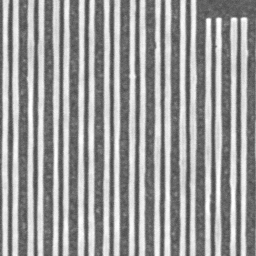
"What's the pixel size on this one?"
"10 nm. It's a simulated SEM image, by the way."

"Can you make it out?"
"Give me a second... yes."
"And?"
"parallel lines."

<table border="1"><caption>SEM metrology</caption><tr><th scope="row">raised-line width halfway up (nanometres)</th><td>48.9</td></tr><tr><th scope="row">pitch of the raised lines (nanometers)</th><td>126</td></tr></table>